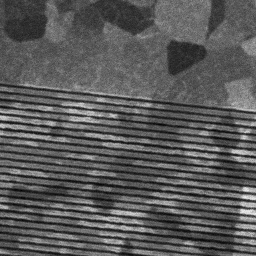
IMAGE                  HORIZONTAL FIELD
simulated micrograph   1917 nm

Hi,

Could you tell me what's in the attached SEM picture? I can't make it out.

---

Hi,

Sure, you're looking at parallel lines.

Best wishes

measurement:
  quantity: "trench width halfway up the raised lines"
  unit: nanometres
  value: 27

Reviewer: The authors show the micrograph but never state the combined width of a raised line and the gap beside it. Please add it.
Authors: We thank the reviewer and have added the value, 55 nm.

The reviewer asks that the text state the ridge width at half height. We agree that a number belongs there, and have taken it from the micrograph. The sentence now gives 33.5 nm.